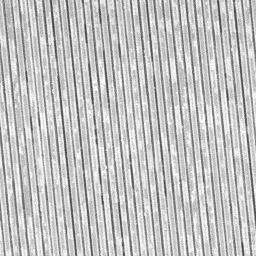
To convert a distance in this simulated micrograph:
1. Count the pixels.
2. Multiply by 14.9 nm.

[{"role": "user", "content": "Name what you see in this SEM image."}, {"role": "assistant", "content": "parallel lines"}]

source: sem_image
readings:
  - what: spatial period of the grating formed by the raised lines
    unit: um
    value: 0.118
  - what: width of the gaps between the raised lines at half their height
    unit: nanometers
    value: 42.6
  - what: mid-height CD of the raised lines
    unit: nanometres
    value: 70.4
